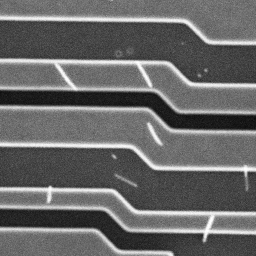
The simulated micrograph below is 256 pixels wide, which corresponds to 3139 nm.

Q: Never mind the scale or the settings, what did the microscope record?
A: groups of lines, slits or small figures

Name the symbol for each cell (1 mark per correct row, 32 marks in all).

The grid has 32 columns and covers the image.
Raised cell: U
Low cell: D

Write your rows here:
UUUUUUUUUUUUUUUUUUUUUUUUUUUUUUUU
UUUUUUUUUUUUUUUUUUUUUUUUUUUUUUUU
DDDDDDDDDDDUUUUUUUUUUUUUUUUUUUUU
DDDDDDDDDDDDDDDDDDDDDDDDUUUUUUUU
DDDDDDDDDDDDDDDDDDDDDDDDDUUUUUUU
DDDDDDDDDDDDDDDDDDDDDDDDDDDDDDDD
DDDDDDDDDDDDDDDDDDDDDDDDDDDDDDDD
DDDDDDDDDDDDDDDDDDDDDDDDDDDDDDDD
UUUUUUUUUUUUUUUUUUUUUUDDDDDDDDDD
UUUUUUUUUUUUUUUUUUUUUUUDDDDDDDDD
UUUUUUUUUUUUUUUUUUUUUUUUDDDDDDDD
DDDDDDDDDDDDDDDDDDDUUUUUUUUUUUUU
DDDDDDDDDDDDDDDDDDDDDUUUUUUUUUUU
UUUUUUUUUUUUUUUUUUDDDDUUUUUUUUUU
UUUUUUUUUUUUUUUUUUUUDDDDDDDDDDDD
UUUUUUUUUUUUUUUUUUUUUDDDDDDDDDDD
UUUUUUUUUUUUUUUUUUUUUUUUUUUUUUUU
UUUUUUUUUUUUUUUUUUUUUUUUUUUUUUUU
DDDDDDDDDDDDDDDDUUUUUUUUUUUUUUUU
DDDDDDDDDDDDDDDDDDUUUUUUUUUUUUUU
DDDDDDDDDDDDDDDDDDDUUUUUUUUUUUUU
DDDDDDDDDDDDDDDDDDDDDDDDDDDDDDDD
DDDDDDDDDDDDDDDDDDDDDDDDDDDDDDDD
DDDDDDDDDDDDDDDDDDDDDDDDDDDDDDDD
UUUUUUUUUUUUUUUDDDDDDDDDDDDDDDDD
UUUUUUUUUUUUUUUUDDDDDDDDDDDDDDDD
DDDDDDDDDDDDDUUUUDDDDDDDDDDDDDDD
DDDDDDDDDDDDDDUUUUUUUUUUUUUUUUUU
DDDDDDDDDDDDDDDDUUUUUUUUUUUUUUUU
UUUUUUUUUUUUUDDDDDDDDDDDDDDDDDDD
UUUUUUUUUUUUUUDDDDDDDDDDDDDDDDDD
UUUUUUUUUUUUUUUUUDDDDDDDDDDDDDDD